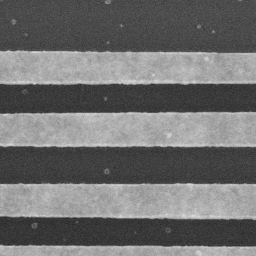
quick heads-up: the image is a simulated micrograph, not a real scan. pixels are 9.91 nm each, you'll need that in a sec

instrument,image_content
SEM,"lines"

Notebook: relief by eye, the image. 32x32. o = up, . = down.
................................
................................
................................
................................
................................
................................
oooooooooooo....................
oooooooooooooooooooooooooooooooo
oooooooooooooooooooooooooooooooo
oooooooooooooooooooooooooooooooo
................................
................................
................................
................................
oooooooooooooooooooooooooooooooo
oooooooooooooooooooooooooooooooo
oooooooooooooooooooooooooooooooo
oooooooooooooooooooooooooooooooo
................................
................................
................................
................................
................................
oooooooooooooooooooooooooooooooo
oooooooooooooooooooooooooooooooo
oooooooooooooooooooooooooooooooo
oooooooooooooooooooooooooooooooo
................................
................................
................................
................................
oooooooooooooooooooooooooooooooo